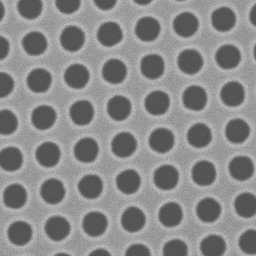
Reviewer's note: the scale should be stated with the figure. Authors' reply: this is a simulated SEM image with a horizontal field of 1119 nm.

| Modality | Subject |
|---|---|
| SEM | a regular array of holes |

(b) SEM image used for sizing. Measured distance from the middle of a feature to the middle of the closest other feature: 0.162 micrometres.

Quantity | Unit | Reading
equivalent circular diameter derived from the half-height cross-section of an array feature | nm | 108